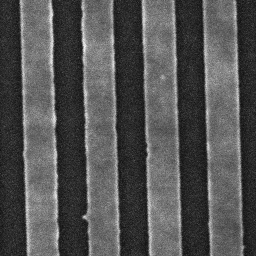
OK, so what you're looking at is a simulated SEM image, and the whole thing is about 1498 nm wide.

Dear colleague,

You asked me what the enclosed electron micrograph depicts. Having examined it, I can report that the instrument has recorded one or a few lines or trenches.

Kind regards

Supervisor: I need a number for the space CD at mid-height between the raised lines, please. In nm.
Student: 177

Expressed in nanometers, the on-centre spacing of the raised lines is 358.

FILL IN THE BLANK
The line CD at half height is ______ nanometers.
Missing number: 182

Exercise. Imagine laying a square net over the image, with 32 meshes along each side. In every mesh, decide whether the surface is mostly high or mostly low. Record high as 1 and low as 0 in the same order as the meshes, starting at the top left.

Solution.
00011100001111000011110001111000
00011100001111000011110000111000
00011100001111000011110000111000
00011100001111000011110000111000
00011110001111000011110000111100
00011110001111000011110000111100
00011100001111000011110000111100
00011100001111000011110000111100
00011110000111000011110000111100
00011110000111000011110000111100
00011110001111000011110000111100
00011110000111000011110000111100
00011110000111000011110000111100
00011110000111000011110000111100
00011110000111000011110000111100
00011110000111000011110000111100
00011110000111100011110000111100
00011110000111100011110000111100
00011110000111000011110000111100
00011110000111100011110000111100
00011110000111100011110000111100
00011110000111100011110000111100
00011110000111100011110000111100
00011110000111100011110000111100
00011110000111100001110000111100
00011110000111100001111000111100
00011110000111100001111000111100
00011110000111100001110000111100
00011110000111100001111000111100
00011110000111100001111000111100
00011110000111100001111000111100
00011110000111100001111000111100